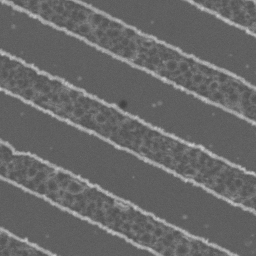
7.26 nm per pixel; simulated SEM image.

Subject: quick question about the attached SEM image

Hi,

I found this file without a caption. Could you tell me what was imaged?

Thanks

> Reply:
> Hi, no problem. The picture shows one or a few lines or trenches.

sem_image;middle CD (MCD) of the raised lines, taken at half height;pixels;33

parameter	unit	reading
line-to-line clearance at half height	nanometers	337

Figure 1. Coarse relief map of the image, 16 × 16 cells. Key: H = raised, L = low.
LHHHHHLLLLLLLHHH
LLLHHHHHLLLLLLLH
LLLLLHHHHHLLLLLL
HLLLLLLHHHHHLLLL
HHHLLLLLLHHHHHLL
HHHHHLLLLLLHHHHH
LLHHHHHLLLLLLHHH
LLLLHHHHHLLLLLLL
LLLLLLHHHHHLLLLL
HLLLLLLLHHHHHLLL
HHHLLLLLLLHHHHHL
LHHHHHLLLLLLHHHH
LLLHHHHHLLLLLLHH
LLLLLHHHHLLLLLLL
LLLLLLLHHHHHLLLL
HHLLLLLLLHHHHHLL